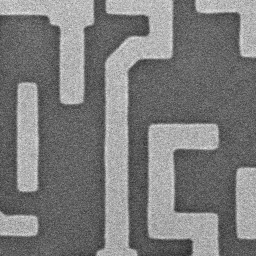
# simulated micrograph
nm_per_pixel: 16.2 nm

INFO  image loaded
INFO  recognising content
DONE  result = wiring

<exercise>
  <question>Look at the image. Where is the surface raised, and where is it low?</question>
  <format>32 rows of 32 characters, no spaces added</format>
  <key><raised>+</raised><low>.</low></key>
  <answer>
++++++++++++.++++++++....+++++++
++++++++++++..+++++++....+++.+++
......++++++.......++.........++
.......++++........++.........++
........++........+++.........++
........++.....++++++.........++
........++....+++++++.........++
........++...++++...............
........++...+++................
........++...+++................
...+....++...+++................
..+++...++...+++................
..+++...++...+++................
..+++........+++................
..+++........+++................
..+++........+++................
..+++........+++...++++++++.....
..+++........+++...++++++++.....
..+++........+++...++++++++.....
..+++........+++...+++..........
..+++........+++...+++..........
..+++........+++...+++........++
..+++........+++...+++........++
..++.........+++...+++........++
.............+++...+++........++
.............+++...+++........++
.............+++...+++........++
+++++........+++...++++++++...++
+++++........+++...++++++++...++
.............+++...++++++++...++
.............+++........+++.....
............+++++.......+++.....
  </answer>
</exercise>